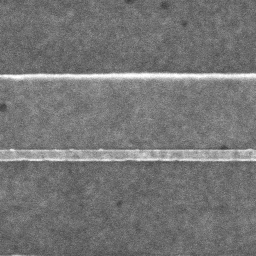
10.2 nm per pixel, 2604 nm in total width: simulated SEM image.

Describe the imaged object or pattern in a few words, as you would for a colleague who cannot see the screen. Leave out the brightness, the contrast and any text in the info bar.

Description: lines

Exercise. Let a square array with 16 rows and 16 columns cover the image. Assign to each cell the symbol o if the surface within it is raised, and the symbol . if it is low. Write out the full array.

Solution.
................
................
................
................
................
oooooooooooooooo
oooooooooooooooo
oooooooooooooooo
oooooooooooooooo
oooooooooooooooo
................
................
................
................
................
................